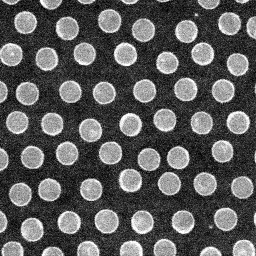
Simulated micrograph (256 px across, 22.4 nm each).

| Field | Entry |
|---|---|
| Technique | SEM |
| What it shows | a regular array of raised bodies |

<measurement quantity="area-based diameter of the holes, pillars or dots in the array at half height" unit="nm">488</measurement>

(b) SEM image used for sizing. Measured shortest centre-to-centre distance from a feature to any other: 736 nm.